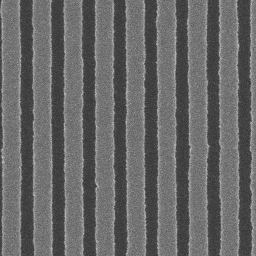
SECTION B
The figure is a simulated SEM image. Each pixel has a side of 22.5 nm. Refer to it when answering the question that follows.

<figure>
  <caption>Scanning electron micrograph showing parallel lines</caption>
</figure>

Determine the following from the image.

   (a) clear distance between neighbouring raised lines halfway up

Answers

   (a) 0.296 µm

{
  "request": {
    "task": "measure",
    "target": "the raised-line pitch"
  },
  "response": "701 nm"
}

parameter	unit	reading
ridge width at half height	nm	411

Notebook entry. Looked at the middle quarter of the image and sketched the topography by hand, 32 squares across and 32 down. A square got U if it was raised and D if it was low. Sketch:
UUUUUDDDUUUUDDDDUUUUDDDUUUUUDDDU
UUUUUDDDUUUUDDDDUUUUDDDUUUUUDDDU
UUUUUDDDUUUUDDDDUUUUDDDUUUUUDDDU
UUUUUDDDUUUUDDDDUUUUDDDUUUUUDDDU
UUUUUDDDUUUUDDDDUUUUDDDDUUUUDDDU
UUUUUDDDUUUUDDDDUUUUDDDDUUUUDDDU
UUUUUDDDUUUUDDDDUUUUDDDDUUUUDDDU
UUUUUDDDUUUUDDDDUUUUDDDDUUUUDDDU
UUUUUDDDUUUUDDDDUUUUDDDDUUUUDDDU
UUUUUDDDUUUUUDDDUUUUDDDUUUUUDDDU
UUUUUDDDUUUUDDDDUUUUDDDDUUUUDDDU
UUUUDDDDUUUUDDDDUUUUDDDUUUUUDDDU
UUUUDDDDUUUUDDDDUUUUDDDDUUUUDDDU
UUUUUDDDUUUUDDDDUUUUDDDDUUUUDDDU
UUUUDDDDUUUUDDDDUUUUDDDUUUUUDDDU
UUUUUDDDUUUUDDDDUUUUDDDDUUUUDDDU
UUUUUDDDUUUUDDDDUUUUDDDDUUUUDDDU
UUUUUDDDUUUUDDDDUUUUDDDUUUUUDDDU
UUUUUDDDUUUUDDDDUUUUDDDUUUUUDDDU
UUUUUDDDUUUUDDDDUUUUDDDDUUUUDDDU
UUUUUDDDUUUUUDDDUUUUDDDDUUUUDDDD
UUUUUDDDUUUUUDDDUUUUDDDDUUUUDDDU
UUUUUDDDUUUUDDDDUUUUDDDDUUUUDDDU
UUUUUDDDUUUUDDDDUUUUDDDDUUUUDDDD
UUUUUDDDUUUUDDDDUUUUDDDDUUUUDDDU
UUUUUDDDUUUUDDDDUUUUDDDDUUUUDDDU
UUUUUDDDUUUUDDDDUUUUDDDDUUUUDDDU
UUUUUDDDUUUUUDDDUUUUDDDDUUUUDDDU
UUUUUDDDUUUUUDDDUUUUDDDUUUUUDDDU
UUUUUDDDUUUUUDDDUUUUDDDUUUUUDDDU
UUUUUDDDUUUUUDDDUUUUDDDUUUUUDDDU
UUUUUDDDUUUUUDDDUUUUDDDDUUUUDDDU